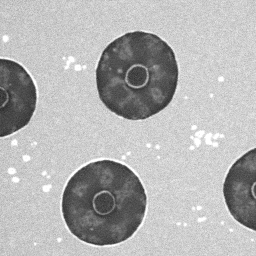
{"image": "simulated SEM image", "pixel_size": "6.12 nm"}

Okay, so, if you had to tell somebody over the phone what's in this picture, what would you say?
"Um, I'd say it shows ring-shaped grooves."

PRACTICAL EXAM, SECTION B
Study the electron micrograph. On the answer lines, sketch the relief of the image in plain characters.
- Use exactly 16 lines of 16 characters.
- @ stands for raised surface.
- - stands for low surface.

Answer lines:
@@@@@@@@@@@@@@@@
@@@@@@@@@@@@@@@@
@@@@@@@---@@@@@@
@@@@@@-----@@@@@
--@@@@--@--@@@@@
--@@@@-----@@@@@
--@@@@-----@@@@@
--@@@@@@-@@@@@@@
@@@@@@@@@@@@@@@@
@@@@@@@@@@@@@@@-
@@@@@---@@@@@@--
@@@@-----@@@@@--
@@@@--@--@@@@@--
@@@@-----@@@@@@-
@@@@----@@@@@@@@
@@@@@@@@@@@@@@@@